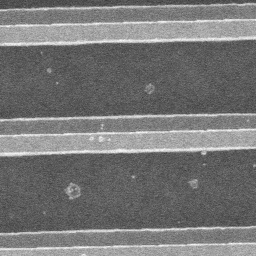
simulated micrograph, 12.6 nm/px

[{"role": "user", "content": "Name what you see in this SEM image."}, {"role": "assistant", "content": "lines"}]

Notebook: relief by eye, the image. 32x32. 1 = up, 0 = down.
00000000000000000000000000000000
11111111111111111111111111111111
11111111111111111111111111111111
11111111111111111111111111111111
11111111111111111111111111111111
11110000000000000000000000000000
00000000000000000000000000000000
00000000000000000000000000000000
00000000000000000000000000000000
00000000000000000000000000000000
00000000000000000000000000000000
00000000000000000000000000000000
00000000000000000000000000000000
00000000000000000000000000000000
00000000000000000000000001111111
11111111111111111111111111111111
11111111111111111111111111111111
11111111111111111111111111111111
11111111111111111111111111111100
00000000000000000000000000000000
00000000000000000000000000000000
00000000000000000000000000000000
00000000000000000000000000000000
00000000000000000000000000000000
00000000000000000000000000000000
00000000000000000000000000000000
00000000000000000000000000000000
00000000000000000000000000000000
00000000000000000000000000000001
11111111111111111111111111111111
11111111111111111111111111111111
11111111111111111111111111111111